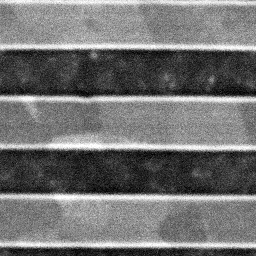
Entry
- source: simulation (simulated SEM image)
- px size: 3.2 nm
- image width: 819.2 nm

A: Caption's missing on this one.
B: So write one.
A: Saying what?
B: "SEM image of one or a few lines or trenches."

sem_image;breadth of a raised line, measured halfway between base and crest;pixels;47.7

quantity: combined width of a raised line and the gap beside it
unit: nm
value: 314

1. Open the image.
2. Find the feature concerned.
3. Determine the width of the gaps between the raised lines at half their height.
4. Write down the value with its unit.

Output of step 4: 162 nm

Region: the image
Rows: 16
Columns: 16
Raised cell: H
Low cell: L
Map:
HHHHHHHHHHHHHHHH
HHHHHHHHHHHHHHHH
HHHHHHHHHHHHHHHH
LLLLLLLLLLLLLLLL
LLLLLLLLLLLLLLLL
LLLLLLLLLLLLLLLL
HHHHHHHHHHHHHHHH
HHHHHHHHHHHHHHHH
HHHHHHHHHHHHHHHH
LLLLLLLLLLLLLLLL
LLLLLLLLLLLLLLLL
LLLLLLLLLLLLLLLL
HHHHHHHHHHHHHHHH
HHHHHHHHHHHHHHHH
HHHHHHHHHHHHHHHH
LLLLLLLLLLLLLLLL